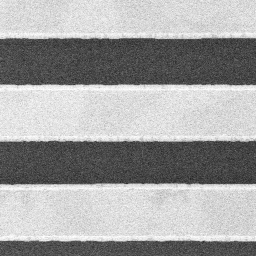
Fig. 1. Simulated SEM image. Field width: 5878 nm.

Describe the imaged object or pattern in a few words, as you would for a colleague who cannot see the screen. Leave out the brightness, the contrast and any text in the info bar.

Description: lines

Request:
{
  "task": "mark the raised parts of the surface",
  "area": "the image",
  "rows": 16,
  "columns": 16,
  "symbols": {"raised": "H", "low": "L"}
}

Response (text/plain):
HHHHHHHHHHHHHHHH
HHHHHHHHHHHHHHHH
LLLLLLLLLLLLLLLL
LLLLLLLLLLLLLLLL
LLLLLLLLLLLLLLLL
HHHHHHHHHLHHHHHH
HHHHHHHHHHHHHHHH
HHHHHHHHHHHHHHHH
HHHHHHHHHHHHHHHH
LLLLLLLLLLLLLLLL
LLLLLLLLLLLLLLLL
LLLLLLLLLLLLLLLL
HHHHHHHHHHHHHHHH
HHHHHHHHHHHHHHHH
HHHHHHHHHHHHHHHH
LLLLLLLLLLLLLLLL